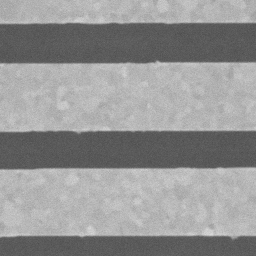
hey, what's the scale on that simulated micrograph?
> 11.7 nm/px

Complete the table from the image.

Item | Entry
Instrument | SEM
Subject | lines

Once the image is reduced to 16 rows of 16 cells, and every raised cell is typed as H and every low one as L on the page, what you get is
HHHHHHHHHHHHHHHH
LLLLLLLLLLLLLLLL
LLLLLLLLLLLLLLLL
LLLLLLLLLLLLLLLL
HHHHHHHHHHHHHHHH
HHHHHHHHHHHHHHHH
HHHHHHHHHHHHHHHH
HHHHHHHHHHHHHHHH
LLLLLLLLLLLLLLLL
LLLLLLLLLLLLLLLL
LLLLLLLLLLLLLLLL
HHHHHHHHHHHHHHHH
HHHHHHHHHHHHHHHH
HHHHHHHHHHHHHHHH
HHHHHHHHHHHHHHHH
LLLLLLLLLLLLLLLL